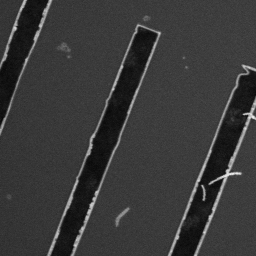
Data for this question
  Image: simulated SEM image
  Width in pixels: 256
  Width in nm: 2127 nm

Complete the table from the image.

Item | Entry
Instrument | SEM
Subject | one or a few lines or trenches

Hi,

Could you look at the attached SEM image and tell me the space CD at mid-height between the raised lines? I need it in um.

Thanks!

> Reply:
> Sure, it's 0.738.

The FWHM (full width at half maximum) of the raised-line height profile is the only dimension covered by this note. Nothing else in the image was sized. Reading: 209 nm